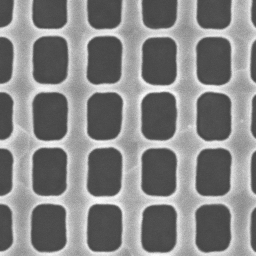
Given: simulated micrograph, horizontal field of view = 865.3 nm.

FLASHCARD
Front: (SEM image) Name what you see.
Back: a regular array of holes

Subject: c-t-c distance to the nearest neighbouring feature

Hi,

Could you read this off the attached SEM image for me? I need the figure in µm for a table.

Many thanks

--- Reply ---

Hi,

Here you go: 0.184